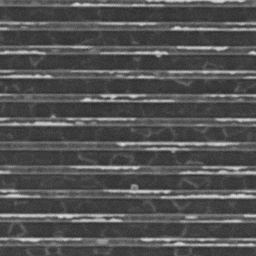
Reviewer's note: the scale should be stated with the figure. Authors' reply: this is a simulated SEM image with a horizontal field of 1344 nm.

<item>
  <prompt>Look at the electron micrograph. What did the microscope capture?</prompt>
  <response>parallel lines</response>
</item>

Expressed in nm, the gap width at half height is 83.4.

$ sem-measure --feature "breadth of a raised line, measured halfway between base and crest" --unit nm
41.4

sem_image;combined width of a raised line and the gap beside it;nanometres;126